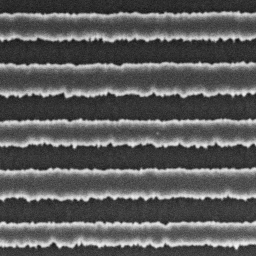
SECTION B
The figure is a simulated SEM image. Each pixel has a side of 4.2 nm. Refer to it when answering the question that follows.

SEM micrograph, lines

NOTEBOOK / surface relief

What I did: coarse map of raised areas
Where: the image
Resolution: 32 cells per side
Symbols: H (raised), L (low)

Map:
LLLLLLLLLLLLLLLLLLLLLLLLLLLLLLLL
LLLLLLLLLLLLLLLLLLLLLLLLLLLLLLLL
HHHHHHHHHHHHHHHHHHHHHHHHHHHHHHHH
HHHHHHHHHHHHHHHHHHHHHHHHHHHHHHHH
HHHHHHHHHHHHHHHHHHHHHHHHHHHHHHHH
LLLLLLLLLLLLLLLLLLLLLLLLLLLLLLLL
LLLLLLLLLLLLLLLLLLLLLLLLLLLLLLLL
LLLLLLLLLLLLLLLLLLLLLLLLLLLLLLLL
HHHHHHHHHHHHHHHHHHHHHHHHHHHHHHHH
HHHHHHHHHHHHHHHHHHHHHHHHHHHHHHHH
HHHHHHHHHHHHHHHHHHHHHHHHHHHHHHHH
HHHHHHHHHHHHHHHHHHHHHHHHHHHHHHHH
LLLLLLLLLLLLLLLLLLLLLLLLLLLLLLLL
LLLLLLLLLLLLLLLLLLLLLLLLLLLLLLLL
LLLLLLLLLLLLLLLLLLLLLLLLLLLLLLLL
HHHHHHHHHHHHHHHHHHHHHHHHHHHHHHHH
HHHHHHHHHHHHHHHHHHHHHHHHHHHHHHHH
HHHHHHHHHHHHHHHHHHHHHHHHHHHHHHHH
LLLLLLLLLLLLLLLLLLLLLLLLLLLLLLLL
LLLLLLLLLLLLLLLLLLLLLLLLLLLLLLLL
LLLLLLLLLLLLLLLLLLLLLLLLLLLLLLLL
HHHHHHHHHHHHHHHHHHHHHHHHHHHHHHHH
HHHHHHHHHHHHHHHHHHHHHHHHHHHHHHHH
HHHHHHHHHHHHHHHHHHHHHHHHHHHHHHHH
HHHHHHHHHHHHHHHHHHHHHHHHHHHHHHHH
LLLLLLLLLLLLLLLLLLLLLLLLLLLLLLLL
LLLLLLLLLLLLLLLLLLLLLLLLLLLLLLLL
LLLLLLLLLLLLLLLLLLLLLLLLLLLLLLLL
HHHHHHHHHHHHHHHHHHHHHHHHHHHHHHHH
HHHHHHHHHHHHHHHHHHHHHHHHHHHHHHHH
HHHHHHLHHHLLHHHHHHHHHHHHHHHHHHHL
LLLLLLLLLLLLLLLLLLLLLLLLLLLLLLLL